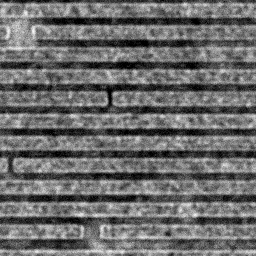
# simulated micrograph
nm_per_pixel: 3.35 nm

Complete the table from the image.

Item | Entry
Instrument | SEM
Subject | parallel lines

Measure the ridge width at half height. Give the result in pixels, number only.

12.4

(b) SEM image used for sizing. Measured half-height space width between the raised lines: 32.7 nanometers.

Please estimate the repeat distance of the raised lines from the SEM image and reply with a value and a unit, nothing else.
74.2 nanometres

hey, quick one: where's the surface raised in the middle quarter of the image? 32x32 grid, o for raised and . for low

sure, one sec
................................
................................
oooooooooooooooooooooooooooooooo
oooooooooooooooooooooooooooooooo
oooooooooooooooooooooooooooooooo
................................
................................
ooooooooooo.oooooooooooooooooooo
ooooooooooo.oooooooooooooooooooo
ooooooooooo.oooooooooooooooooooo
................................
................................
................................
oooooooooooooooooooooooooooooooo
oooooooooooooooooooooooooooooooo
oooooooooooooooooooooooooooooooo
................................
................................
oooooooooooooooooooooooooooooooo
oooooooooooooooooooooooooooooooo
oooooooooooooooooooooooooooooooo
................................
................................
................................
oooooooooooooooooooooooooooooooo
oooooooooooooooooooooooooooooooo
oooooooooooooooooooooooooooooooo
................................
................................
................................
oooooooooooooooooooooooooooooooo
oooooooooooooooooooooooooooooooo